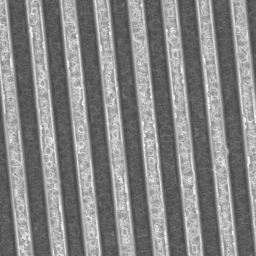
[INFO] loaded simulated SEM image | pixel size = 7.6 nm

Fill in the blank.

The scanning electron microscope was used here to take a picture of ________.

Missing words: parallel lines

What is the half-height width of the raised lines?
126 nanometers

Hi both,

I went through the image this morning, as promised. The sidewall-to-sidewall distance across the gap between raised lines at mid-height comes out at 0.134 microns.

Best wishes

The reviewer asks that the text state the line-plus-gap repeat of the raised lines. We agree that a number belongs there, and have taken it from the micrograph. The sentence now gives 257 nanometers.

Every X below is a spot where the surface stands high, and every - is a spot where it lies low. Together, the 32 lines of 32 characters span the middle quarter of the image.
-XXX-----XXXX-----XXX-----XXXX--
-XXXX----XXXX-----XXX-----XXXX--
-XXXX----XXXX-----XXXX----XXXX--
-XXXX----XXXX-----XXXX----XXXX--
-XXXX----XXXX-----XXXX----XXXX--
-XXXX-----XXXX----XXXX----XXXX--
-XXXX-----XXXX----XXXX-----XXXX-
-XXXX-----XXXX----XXXX-----XXXX-
--XXX-----XXXX----XXXX-----XXXX-
--XXX-----XXXX-----XXX-----XXXX-
--XXX-----XXXX-----XXX-----XXXX-
--XXXX----XXXX-----XXXX----XXXX-
--XXXX----XXXX-----XXXX----XXXX-
--XXXX----XXXX-----XXXX-----XXX-
--XXXX----XXXX-----XXXX----XXXX-
--XXXX-----XXXX----XXXX-----XXXX
--XXXX-----XXXX----XXXX-----XXXX
--XXXX-----XXXX----XXXX-----XXXX
--XXXX-----XXXX----XXXX-----XXXX
--XXXX-----XXXX-----XXXX----XXXX
---XXX-----XXXX-----XXXX----XXXX
---XXXX----XXXX-----XXXX----XXXX
---XXXX----XXXX-----XXXX----XXXX
---XXXX----XXXX-----XXXX----XXXX
---XXXX----XXXXX----XXXX----XXXX
---XXXX-----XXXX----XXXX-----XXX
---XXXX-----XXXX----XXXX-----XXX
---XXXX-----XXXX----XXXX-----XXX
----XXX-----XXXX-----XXX-----XXX
----XXX-----XXXX-----XXX-----XXX
----XXXX----XXXX-----XXX-----XXX
----XXXX----XXXX-----XXXX----XXX